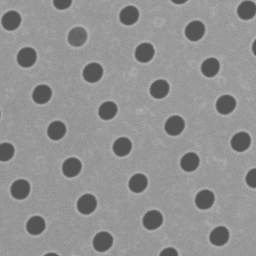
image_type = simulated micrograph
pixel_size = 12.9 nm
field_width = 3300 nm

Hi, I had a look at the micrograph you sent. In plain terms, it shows a regular array of holes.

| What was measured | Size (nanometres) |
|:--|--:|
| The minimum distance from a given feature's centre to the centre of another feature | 509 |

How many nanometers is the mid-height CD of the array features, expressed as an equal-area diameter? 263